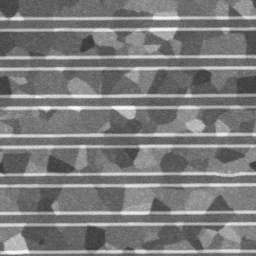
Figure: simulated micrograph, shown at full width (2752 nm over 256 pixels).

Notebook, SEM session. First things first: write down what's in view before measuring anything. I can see parallel lines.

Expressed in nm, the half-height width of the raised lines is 294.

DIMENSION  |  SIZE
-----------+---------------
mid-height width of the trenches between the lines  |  126 nm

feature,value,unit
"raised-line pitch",0.419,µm